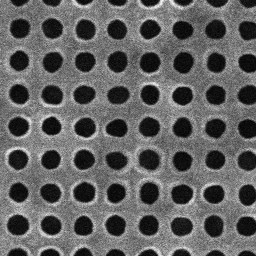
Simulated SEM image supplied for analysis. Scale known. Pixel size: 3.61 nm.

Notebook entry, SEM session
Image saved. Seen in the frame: a regular array of holes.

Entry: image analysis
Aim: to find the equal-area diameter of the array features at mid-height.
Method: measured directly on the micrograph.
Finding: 72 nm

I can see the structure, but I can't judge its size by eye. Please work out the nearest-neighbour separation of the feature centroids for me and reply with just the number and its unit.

116 nm